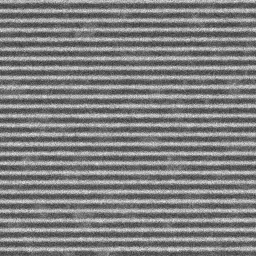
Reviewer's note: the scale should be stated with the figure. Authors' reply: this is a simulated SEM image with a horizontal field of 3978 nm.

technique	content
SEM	parallel lines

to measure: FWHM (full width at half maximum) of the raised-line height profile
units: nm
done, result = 31.1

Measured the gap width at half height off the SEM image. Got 0.115 microns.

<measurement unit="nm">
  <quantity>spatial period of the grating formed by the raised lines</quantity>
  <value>148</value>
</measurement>